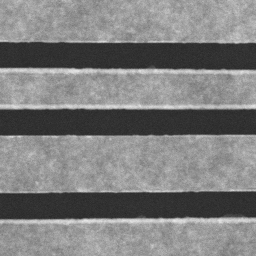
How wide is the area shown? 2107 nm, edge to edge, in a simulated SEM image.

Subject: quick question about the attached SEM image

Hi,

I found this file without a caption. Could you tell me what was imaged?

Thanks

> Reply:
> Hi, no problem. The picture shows lines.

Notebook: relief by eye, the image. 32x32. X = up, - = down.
XXXXXXXXXXXXXXXXXXXXXXXXXXXXXXXX
XXXXXXXXXXXXXXXXXXXXXXXXXXXXXXXX
XXXXXXXXXXXXXXXXXXXXXXXXXXXXXXXX
XXXXXXXXXXXXXXXXXXXXXXXXXXXXXXXX
XXXXXXXXXXXXXXXXXXXXXXXXXXXXXXXX
--------------------------------
--------------------------------
--------------------------------
--------------------------------
XXXXXXXXXXXXXXXXXXXXXXXXXXXXXXXX
XXXXXXXXXXXXXXXXXXXXXXXXXXXXXXXX
XXXXXXXXXXXXXXXXXXXXXXXXXXXXXXXX
XXXXXXXXXXXXXXXXXXXXXXXXXXXXXXXX
XXXXXXXXXXXXXXXXXXXXXXXXXXXXXXXX
--------------------------------
--------------------------------
--------------------------------
XXXXXXXXXXXXXXXXXXXXXXXXXXXXXXXX
XXXXXXXXXXXXXXXXXXXXXXXXXXXXXXXX
XXXXXXXXXXXXXXXXXXXXXXXXXXXXXXXX
XXXXXXXXXXXXXXXXXXXXXXXXXXXXXXXX
XXXXXXXXXXXXXXXXXXXXXXXXXXXXXXXX
XXXXXXXXXXXXXXXXXXXXXXXXXXXXXXXX
XXXXXXXXXXXXXXXXXXXXXXXXXXXXXXXX
--------------------------------
--------------------------------
--------------------------------
XXXXXXXXXXXXXXXXXXXXXXXXXXXXXXXX
XXXXXXXXXXXXXXXXXXXXXXXXXXXXXXXX
XXXXXXXXXXXXXXXXXXXXXXXXXXXXXXXX
XXXXXXXXXXXXXXXXXXXXXXXXXXXXXXXX
XXXXXXXXXXXXXXXXXXXXXXXXXXXXXXXX